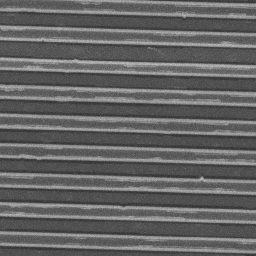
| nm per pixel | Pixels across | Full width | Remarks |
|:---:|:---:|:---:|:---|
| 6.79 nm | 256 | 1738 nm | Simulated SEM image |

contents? parallel lines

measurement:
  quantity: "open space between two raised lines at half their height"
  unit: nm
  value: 115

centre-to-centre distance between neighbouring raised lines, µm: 0.2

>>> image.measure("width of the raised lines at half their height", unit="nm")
85.7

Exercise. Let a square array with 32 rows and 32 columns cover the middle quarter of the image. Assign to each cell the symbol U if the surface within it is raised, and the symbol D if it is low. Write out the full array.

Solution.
UUUUUUUUUUUUUUUUUUUUUUUUUUUUUUUU
UUUUUUUUUUUUUUUUUUUUUUUUUUUUUUUU
DDDDDDDDDDDDDDDDDDDDDDDDDDDUUUUU
DDDDDDDDDDDDDDDDDDDDDDDDDDDDDDDD
DDDDDDDDDDDDDDDDDDDDDDDDDDDDDDDD
DDDDDDDDDDDDDDDDDDDDDDDDDDDDDDDD
UUUUUUUUUUUUUDDDDDDDDDDDDDDDDDDD
UUUUUUUUUUUUUUUUUUUUUUUUUUUUUUUU
UUUUUUUUUUUUUUUUUUUUUUUUUUUUUUUU
DDDDDDDDDDDDDDDDDDDDDDUUUUUUUUUU
DDDDDDDDDDDDDDDDDDDDDDDDDDDDDDDD
DDDDDDDDDDDDDDDDDDDDDDDDDDDDDDDD
DDDDDDDDDDDDDDDDDDDDDDDDDDDDDDDD
UUUUUUUDDDDDDDDDDDDDDDDDDDDDDDDD
UUUUUUUUUUUUUUUUUUUUUUUUUUUUUUUU
UUUUUUUUUUUUUUUUUUUUUUUUUUUUUUUU
DDDDDDDDDDUUUUUUUUUUUUUUUUUUUUUU
DDDDDDDDDDDDDDDDDDDDDDDDDDDDDDDD
DDDDDDDDDDDDDDDDDDDDDDDDDDDDDDDD
DDDDDDDDDDDDDDDDDDDDDDDDDDDDDDDD
DDDDDDDDDDDDDDDDDDDDDDDDDDDDDDDD
UUUUUUUUUUUUUUUUUUUUUUUUUUUUDDDD
UUUUUUUUUUUUUUUUUUUUUUUUUUUUUUUU
UUUUUUUUUUUUUUUUUUUUUUUUUUUUUUUU
DDDDDDDDDDDDDDDDDDDDDDDDDDDDDDUU
DDDDDDDDDDDDDDDDDDDDDDDDDDDDDDDD
DDDDDDDDDDDDDDDDDDDDDDDDDDDDDDDD
DDDDDDDDDDDDDDDDDDDDDDDDDDDDDDDD
UUUUUUUUUUUUUUUUDDDDDDDDDDDDDDDD
UUUUUUUUUUUUUUUUUUUUUUUUUUUUUUUU
UUUUUUUUUUUUUUUUUUUUUUUUUUUUUUUU
DDDDDDDDDDDDDDDDDDUUUUUUUUUUUUUU